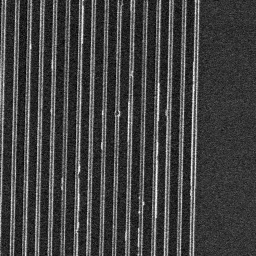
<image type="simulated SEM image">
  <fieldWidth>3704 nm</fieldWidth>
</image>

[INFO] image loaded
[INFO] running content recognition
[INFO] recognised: parallel lines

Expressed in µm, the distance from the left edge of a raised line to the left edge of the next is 0.186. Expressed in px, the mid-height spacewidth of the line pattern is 9.74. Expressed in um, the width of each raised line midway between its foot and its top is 0.0434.